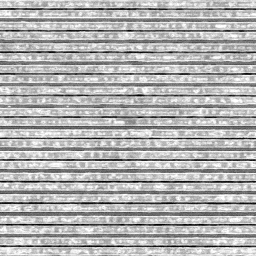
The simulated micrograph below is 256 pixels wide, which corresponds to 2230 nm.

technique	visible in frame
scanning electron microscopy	parallel lines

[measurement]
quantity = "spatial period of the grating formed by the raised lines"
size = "93.7 nm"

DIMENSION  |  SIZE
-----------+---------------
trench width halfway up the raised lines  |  0.0261 µm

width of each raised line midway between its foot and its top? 0.0686 um